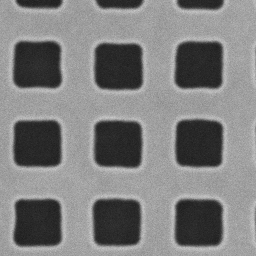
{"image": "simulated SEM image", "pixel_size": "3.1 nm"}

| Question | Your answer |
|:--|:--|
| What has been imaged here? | a regular array of holes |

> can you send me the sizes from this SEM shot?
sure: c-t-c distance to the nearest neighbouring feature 243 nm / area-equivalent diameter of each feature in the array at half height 162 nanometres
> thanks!